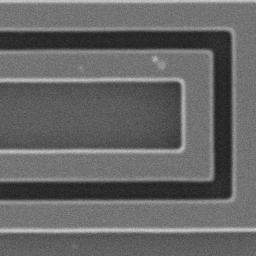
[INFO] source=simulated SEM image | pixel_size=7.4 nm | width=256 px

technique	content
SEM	groups of lines, slits or small figures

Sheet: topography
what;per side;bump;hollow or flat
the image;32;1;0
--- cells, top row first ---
11111111111111111111111111111111
11111111111111111111111111111111
11111111111111111111111111111111
11111111111111111111111111111111
00000000000000000000000000000111
00000000000000000000000000000111
11111111111111111111111111000111
11111111111111111111111111000111
11111111111111111111111111000111
11111111111111111111111111000111
00000000000000000000000111000111
00000000000000000000000111000111
00000000000000000000000111000111
00000000000000000000000111000111
00000000000000000000000111000111
00000000000000000000000111000111
00000000000000000000000111000111
00000000000000000000000111000111
00000000000000000000000111100111
11111111111111111111111111100111
11111111111111111111111111100111
11111111111111111111111111100111
11111111111111111000000011000111
00000000000000000000000000000111
00000000000000000000000000000111
11111111111111111111111111111111
11111111111111111111111111111111
11111111111111111111111111111111
11111111111111111111111111111111
00000000000000000000000000000000
00000000000000000000000000000000
00000000000000000000000000000000